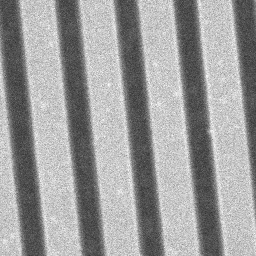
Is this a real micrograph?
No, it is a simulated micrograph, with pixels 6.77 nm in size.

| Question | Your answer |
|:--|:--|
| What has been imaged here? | parallel lines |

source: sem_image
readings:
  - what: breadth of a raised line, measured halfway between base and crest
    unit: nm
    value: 246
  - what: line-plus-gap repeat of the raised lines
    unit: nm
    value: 398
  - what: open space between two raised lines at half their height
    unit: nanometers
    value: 153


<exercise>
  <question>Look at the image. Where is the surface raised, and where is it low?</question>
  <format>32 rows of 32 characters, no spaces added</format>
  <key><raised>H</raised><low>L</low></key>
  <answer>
LLHHHHHLLLHHHHLLLHHHHHLLLHHHHLLL
LLHHHHHLLLHHHHLLLHHHHHLLLHHHHLLL
LLLHHHHLLLHHHHHLLHHHHHLLLHHHHLLL
LLLHHHHLLLHHHHHLLLHHHHLLLHHHHLLL
LLLHHHHLLLHHHHHLLLHHHHLLLHHHHHLL
LLLHHHHLLLHHHHHLLLHHHHLLLHHHHHLL
LLLHHHHHLLHHHHHLLLHHHHLLLHHHHHLL
LLLHHHHHLLLHHHHLLLHHHHLLLHHHHHLL
LLLHHHHHLLLHHHHLLLHHHHHLLHHHHHLL
LLLHHHHHLLLHHHHLLLHHHHHLLLHHHHLL
HLLHHHHHLLLHHHHLLLHHHHHLLLHHHHLL
HLLLHHHHLLLHHHHHLLHHHHHLLLHHHHLL
HLLLHHHHLLLHHHHHLLLHHHHLLLHHHHLL
HLLLHHHHLLLHHHHHLLLHHHHLLLHHHHLL
HLLLHHHHLLLHHHHHLLLHHHHLLLHHHHHL
HLLLHHHHLLLHHHHHLLLHHHHLLLHHHHHL
HLLLHHHHHLLLHHHHLLLHHHHLLLHHHHHL
HLLLHHHHHLLLHHHHLLLHHHHLLLHHHHHL
HLLLHHHHHLLLHHHHLLLHHHHHLLLHHHHL
HHLLHHHHHLLLHHHHLLLHHHHHLLLHHHHL
HHLLLHHHHLLLHHHHLLLHHHHHLLLHHHHL
HHLLLHHHHLLLHHHHHLLHHHHHLLLHHHHL
HHLLLHHHHLLLHHHHHLLLHHHHLLLHHHHL
HHLLLHHHHLLLHHHHHLLLHHHHLLLHHHHH
HHLLLHHHHLLLHHHHHLLLHHHHLLLHHHHH
HHLLLHHHHHLLHHHHHLLLHHHHLLLHHHHH
HHLLLHHHHHLLLHHHHLLLHHHHHLLHHHHH
HHLLLHHHHHLLLHHHHLLLHHHHHLLLHHHH
HHLLLHHHHHLLLHHHHLLLHHHHHLLLHHHH
HHHLLHHHHHLLLHHHHLLLHHHHHLLLHHHH
HHHLLLHHHHLLLHHHHLLLHHHHHLLLHHHH
HHHLLLHHHHLLLHHHHHLLLHHHHLLLHHHH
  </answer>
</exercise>